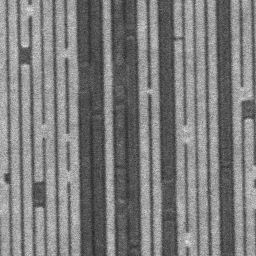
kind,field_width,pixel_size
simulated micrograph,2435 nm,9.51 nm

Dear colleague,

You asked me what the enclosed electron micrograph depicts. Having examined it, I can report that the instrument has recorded parallel lines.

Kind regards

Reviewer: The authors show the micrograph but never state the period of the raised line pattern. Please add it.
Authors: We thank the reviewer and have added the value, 0.111 micrometres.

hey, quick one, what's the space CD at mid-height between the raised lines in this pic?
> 39.2 nm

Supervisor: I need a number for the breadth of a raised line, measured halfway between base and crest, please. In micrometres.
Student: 0.0725